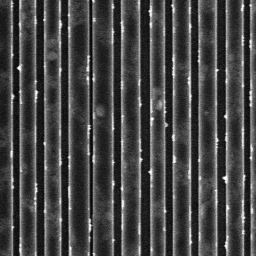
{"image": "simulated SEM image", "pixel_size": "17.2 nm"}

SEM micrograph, parallel lines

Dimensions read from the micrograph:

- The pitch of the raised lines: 443 nm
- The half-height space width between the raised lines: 8.5 pixels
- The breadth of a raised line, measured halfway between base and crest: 307 nm